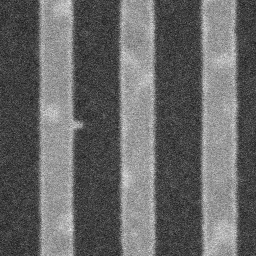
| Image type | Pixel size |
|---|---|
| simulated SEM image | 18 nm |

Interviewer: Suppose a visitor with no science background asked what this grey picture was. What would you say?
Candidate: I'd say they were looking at one or a few lines or trenches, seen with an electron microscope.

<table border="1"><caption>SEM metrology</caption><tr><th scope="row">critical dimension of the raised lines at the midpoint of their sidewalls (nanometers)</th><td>923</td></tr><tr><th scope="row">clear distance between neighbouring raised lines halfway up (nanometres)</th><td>549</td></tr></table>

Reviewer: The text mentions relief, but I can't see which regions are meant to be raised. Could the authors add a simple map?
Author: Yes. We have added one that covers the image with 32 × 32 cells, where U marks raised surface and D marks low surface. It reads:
UUUUUDDDDUUUUUUDDDDUUUUUUDDDDUUU
UUUUUDDDDUUUUUUDDDDUUUUUUDDDDUUU
UUUUUDDDDUUUUUUDDDDUUUUUUDDDDUUU
UUUUUDDDDUUUUUUDDDDUUUUUUDDDDUUU
UUUUUDDDDUUUUUUDDDDUUUUUUDDDDUUU
UUUUUDDDDUUUUUUDDDDUUUUUUDDDDUUU
UUUUUDDDDUUUUUUDDDDUUUUUUDDDDUUU
UUUUUDDDDUUUUUUDDDDUUUUUUUDDDUUU
UUUUUDDDDUUUUUUDDDDUUUUUUDDDDUUU
UUUUUDDDDUUUUUUDDDDUUUUUUDDDDUUU
UUUUUDDDDUUUUUUDDDDUUUUUUDDDDUUU
UUUUUDDDDUUUUUUDDDDUUUUUUUDDDUUU
UUUUUDDDDUUUUUUDDDDUUUUUUUDDDUUU
UUUUUDDDDUUUUUUDDDDUUUUUUUDDDUUU
UUUUUDDDDUUUUUUDDDDUUUUUUUDDDUUU
UUUUUDDDDDUUUUUDDDDUUUUUUDDDDUUU
UUUUUDDDDUUUUUUDDDDUUUUUUUDDDUUU
UUUUUDDDDUUUUUUDDDDUUUUUUDDDDUUU
UUUUUDDDDUUUUUUDDDDUUUUUUDDDDUUU
UUUUUDDDDUUUUUUDDDDUUUUUUDDDDUUU
UUUUUDDDDUUUUUUDDDDUUUUUUDDDDUUU
UUUUUDDDDUUUUUUDDDDUUUUUUDDDDUUU
UUUUUDDDDUUUUUUDDDDUUUUUUDDDDUUU
UUUUUDDDDUUUUUUDDDDUUUUUUUDDDUUU
UUUUUDDDDUUUUUUDDDDUUUUUUDDDDUUU
UUUUUDDDDUUUUUUDDDDUUUUUUDDDDUUU
UUUUUDDDDUUUUUUDDDDUUUUUUUDDDUUU
UUUUUDDDDUUUUUUDDDDUUUUUUUDDDUUU
UUUUUDDDDUUUUUUDDDDUUUUUUDDDDUUU
UUUUUDDDDUUUUUUDDDDUUUUUUUDDDUUU
UUUUUDDDDUUUUUUDDDDUUUUUUUDDDUUU
UUUUUDDDDUUUUUUUDDDUUUUUUUDDDUUU